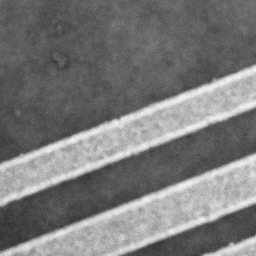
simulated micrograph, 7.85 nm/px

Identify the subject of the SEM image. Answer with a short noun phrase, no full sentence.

one or a few lines or trenches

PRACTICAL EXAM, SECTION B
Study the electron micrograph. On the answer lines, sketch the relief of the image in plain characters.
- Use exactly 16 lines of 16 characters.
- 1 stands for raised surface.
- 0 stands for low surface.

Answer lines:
0000000000000000
0000000000000000
0000000000000000
0000000000000000
0000000000000000
0000000000000111
0000000000111111
0000000011111000
0000011111100000
0001111100000000
1111110000000011
1110000000001111
0000000001111111
0000000111111000
0000111111100000
0111111100000001